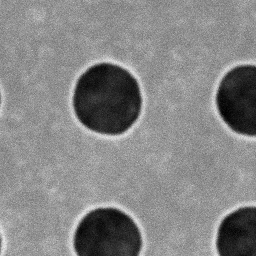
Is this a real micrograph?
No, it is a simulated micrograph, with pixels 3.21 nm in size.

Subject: holes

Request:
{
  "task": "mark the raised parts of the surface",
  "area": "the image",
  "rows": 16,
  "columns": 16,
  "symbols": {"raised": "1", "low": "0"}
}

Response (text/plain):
1111111111111111
1111111111111111
1111111111111111
1111111111111111
1111100011111100
1111100001111100
1111100001111100
1111100001111100
1111111111111110
1111111111111111
1111111111111111
1111111111111111
1111111111111111
1111100011111100
1111100001111100
1111100001111100